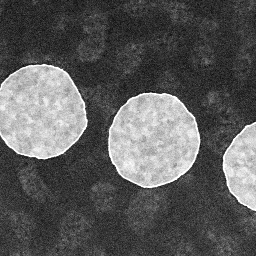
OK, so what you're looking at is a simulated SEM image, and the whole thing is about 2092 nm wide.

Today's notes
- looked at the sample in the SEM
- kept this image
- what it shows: raised bodies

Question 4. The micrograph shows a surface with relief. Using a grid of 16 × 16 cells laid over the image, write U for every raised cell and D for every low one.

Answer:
DDDDDDDDDDDDDDDD
DDDDDDDDDDDDDDDD
DDDDDDDDDDDDDDDD
DDDDDDDDDDDDDDDD
DUUUDDDDDDDDDDDD
UUUUUDDDDDDDDDDD
UUUUUDDDUUUDDDDD
UUUUUDDUUUUUDDDD
UUUUUDDUUUUUDDDU
DUUUDDDUUUUUDDUU
DDDDDDDUUUUUDDUU
DDDDDDDDDUDDDDUU
DDDDDDDDDDDDDDDU
DDDDDDDDDDDDDDDD
DDDDDDDDDDDDDDDD
DDDDDDDDDDDDDDDD